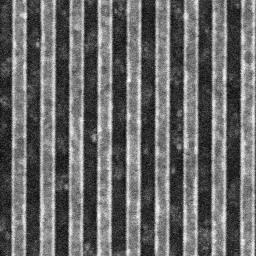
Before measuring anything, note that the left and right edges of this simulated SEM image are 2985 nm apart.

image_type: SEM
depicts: parallel lines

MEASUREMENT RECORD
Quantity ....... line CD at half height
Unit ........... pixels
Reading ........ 11.6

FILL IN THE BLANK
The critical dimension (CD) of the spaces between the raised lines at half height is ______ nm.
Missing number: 192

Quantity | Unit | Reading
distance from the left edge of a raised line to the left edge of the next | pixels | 28.5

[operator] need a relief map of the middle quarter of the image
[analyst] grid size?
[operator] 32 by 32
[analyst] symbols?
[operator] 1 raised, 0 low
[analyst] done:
00111000011100001110000111000011
00111000011100001110000111000011
00111000011100001110000111000011
00111000011100001110000111000011
00111000011100001110000111000011
00111000011100001110000111000011
00111000011100001110000111000011
00111000011100001110000111000011
00111000011100001110000111000011
00111000011100001110000111000011
00111000011100001110000111000011
00111000011100001110000111000011
00111000011100001110000111000011
00111000011100001110000111000011
00111000011100001110000111000011
00111000011100001110000111000011
00111000011100001110000111000011
00110000011100001110000111000011
00110000011100001110000111000011
00110000011100001110000111000011
00111000011100001110000111000011
00110000011100001110000111000011
00111000011100001110000111000011
00111000011100001110000111000011
00110000011100001110000111000011
00110000011100001110000111000011
00110000011100001110000111000011
00110000011100001110000111000011
00110000011100001110000111000011
00110000011100001110000111000011
00110000011100001110000111000011
00110000011100001110000111000011